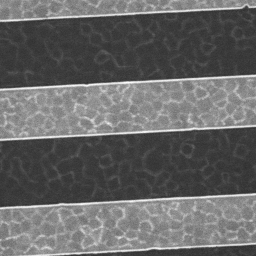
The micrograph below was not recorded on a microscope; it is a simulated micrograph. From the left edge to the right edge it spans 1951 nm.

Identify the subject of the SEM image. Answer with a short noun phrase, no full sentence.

one or a few lines or trenches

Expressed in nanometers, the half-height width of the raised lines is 382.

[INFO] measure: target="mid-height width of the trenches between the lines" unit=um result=0.521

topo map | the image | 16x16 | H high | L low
HHHHHHHHHHHHHHHL
LLLLLLLLLLLLLLLL
LLLLLLLLLLLLLLLL
LLLLLLLLLLLLLLLL
LLLLLLLLLLLLLLLL
LLHHHHHHHHHHHHHH
HHHHHHHHHHHHHHHH
HHHHHHHHHHHHHHHH
HHHHHLLLLLLLLLLL
LLLLLLLLLLLLLLLL
LLLLLLLLLLLLLLLL
LLLLLLLLLLLLLLLL
LLLLLLLLLHHHHHHH
HHHHHHHHHHHHHHHH
HHHHHHHHHHHHHHHH
HHHHHHHHHHHLLLLL